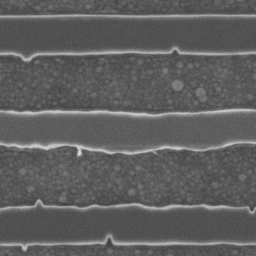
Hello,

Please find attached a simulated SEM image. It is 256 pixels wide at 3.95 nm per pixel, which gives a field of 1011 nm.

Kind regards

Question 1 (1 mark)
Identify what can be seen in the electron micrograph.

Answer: one or a few lines or trenches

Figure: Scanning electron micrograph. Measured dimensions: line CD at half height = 149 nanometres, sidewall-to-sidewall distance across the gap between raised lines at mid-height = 226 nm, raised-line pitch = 376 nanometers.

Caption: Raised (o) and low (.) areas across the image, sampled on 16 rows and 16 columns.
................
oooooooooooooooo
oooooooooooooooo
.o..............
................
................
................
oooooooooooooooo
oooooooooooooooo
.......oo.......
................
................
................
oooooooooooooooo
oooooooooooooooo
................